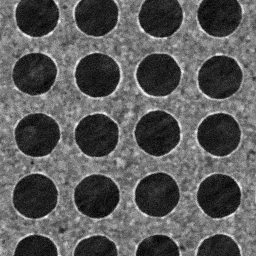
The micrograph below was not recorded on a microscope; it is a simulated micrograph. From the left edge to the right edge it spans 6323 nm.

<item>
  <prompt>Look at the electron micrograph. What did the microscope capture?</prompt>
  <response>a regular array of holes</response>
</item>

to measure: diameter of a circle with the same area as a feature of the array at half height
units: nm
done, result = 1120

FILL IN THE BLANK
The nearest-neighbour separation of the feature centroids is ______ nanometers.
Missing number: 1480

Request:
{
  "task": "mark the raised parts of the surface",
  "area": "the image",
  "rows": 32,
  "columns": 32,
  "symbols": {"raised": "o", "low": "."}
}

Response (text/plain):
oo.....ooo.....ooo.....oo.....oo
oo.....oo......oo......oo.....oo
oo.....oo......oo......oo.....oo
oo.....ooo....oooo....ooo.....oo
oooo..ooooo..oooooo..ooooo..oooo
oooooooooooooooooooooooooooooooo
oooooooooooooooooooooooooooooooo
oo.....ooo....oooo....oooo...ooo
oo.....oo......oo......oo.....oo
oo.....oo......oo.o....oo.....oo
oo.....ooo.....oo.o...ooo.....oo
ooo...oooo....oooo....ooo.....oo
ooooooooooooooooooooooooooo.oooo
oooooooooooooooooooooooooooooooo
ooo...ooooo..ooooo....oooo...ooo
oo.....ooo.....oo.....ooo.....oo
oo......o......oo......oo.....oo
oo.....oo......oo......oo.....oo
oo.....ooo....oooo....ooo.....oo
oooo..ooooo..oooooo.ooooooo.oooo
oooooooooooooooooooooooooooooooo
oooooooooooooooooooooooooooooooo
oo....oooo....oooo....ooo....ooo
oo.....oo......oo.....ooo.....oo
o......oo......oo......oo.....oo
oo.....oo......oo.....ooo.....oo
oo....oooo....oooo...oooo....ooo
oooooooooooooooooooooooooooooooo
oooooooooooooooooooooooooooooooo
ooo...ooooo..oooooo..ooooo...ooo
oo.....ooo....ooo.o...ooo.....oo
oo.....oo.....ooo.....ooo.....oo